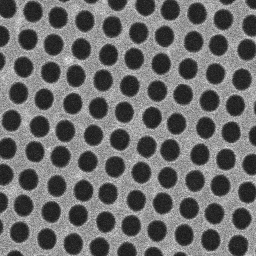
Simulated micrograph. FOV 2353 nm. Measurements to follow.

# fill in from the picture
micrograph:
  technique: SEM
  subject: a regular array of holes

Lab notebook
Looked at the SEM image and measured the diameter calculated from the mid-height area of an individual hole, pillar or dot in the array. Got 178 nanometres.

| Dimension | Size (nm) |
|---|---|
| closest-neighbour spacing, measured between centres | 241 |